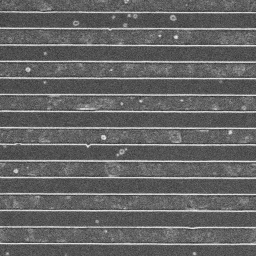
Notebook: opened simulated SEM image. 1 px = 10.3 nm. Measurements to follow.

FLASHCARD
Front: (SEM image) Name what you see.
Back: parallel lines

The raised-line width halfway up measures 174 nm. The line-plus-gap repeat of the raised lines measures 341 nm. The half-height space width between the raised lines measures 16.1 px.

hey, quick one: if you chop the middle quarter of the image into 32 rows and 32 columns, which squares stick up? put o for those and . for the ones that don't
................................
................................
................................
................................
oooooooooooooooooooooooooooooooo
oooooooooooooooooooooooooooooooo
oooooooooooooooooooooooooooooooo
oooooooooooooooooooooooooooooooo
................................
................................
......o.........................
................................
oooooooooooooooooooooooooooooooo
oooooooooooooooooooooooooooooooo
oooooooooooooooooooooooooooooooo
oooooooooooooooooooooooooooooooo
................................
................................
............................o...
................................
oooooooooooooooooooooooooooooooo
oooooooooooooooooooooooooooooooo
oooooooooooooooooooooooooooooooo
oooooooooooooooooooooooooooooooo
................................
................................
................................
................................
................................
oooooooooooooooooooooooooooooooo
oooooooooooooooooooooooooooooooo
oooooooooooooooooooooooooooooooo